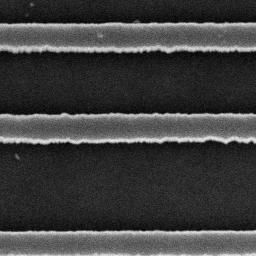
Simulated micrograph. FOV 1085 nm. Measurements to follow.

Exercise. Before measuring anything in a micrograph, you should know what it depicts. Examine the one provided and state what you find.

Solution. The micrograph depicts lines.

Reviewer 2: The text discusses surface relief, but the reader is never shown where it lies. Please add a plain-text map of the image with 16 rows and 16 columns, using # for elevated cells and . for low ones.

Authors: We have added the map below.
................
.###############
################
................
................
................
................
################
################
................
................
................
................
................
.#..######.#####
################